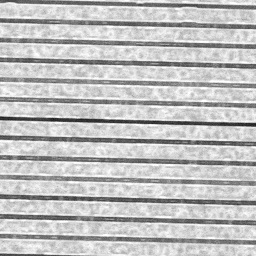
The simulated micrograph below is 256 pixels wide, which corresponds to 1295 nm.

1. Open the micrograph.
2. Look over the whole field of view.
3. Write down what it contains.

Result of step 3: parallel lines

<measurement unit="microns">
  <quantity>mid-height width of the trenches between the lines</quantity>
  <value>0.0247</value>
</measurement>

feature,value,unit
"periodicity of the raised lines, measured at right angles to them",19.6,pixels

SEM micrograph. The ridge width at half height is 74.6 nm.